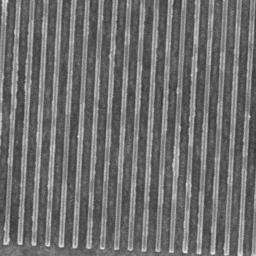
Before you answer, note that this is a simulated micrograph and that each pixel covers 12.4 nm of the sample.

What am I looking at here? parallel lines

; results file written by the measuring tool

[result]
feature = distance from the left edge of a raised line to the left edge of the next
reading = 170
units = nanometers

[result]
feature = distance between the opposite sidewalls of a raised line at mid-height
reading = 54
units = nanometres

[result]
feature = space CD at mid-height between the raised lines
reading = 117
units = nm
